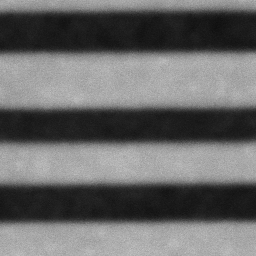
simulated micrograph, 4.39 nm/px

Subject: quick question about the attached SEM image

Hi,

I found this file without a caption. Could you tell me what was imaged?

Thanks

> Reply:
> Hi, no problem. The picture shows one or a few lines or trenches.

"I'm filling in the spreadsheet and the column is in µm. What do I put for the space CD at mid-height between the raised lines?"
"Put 0.191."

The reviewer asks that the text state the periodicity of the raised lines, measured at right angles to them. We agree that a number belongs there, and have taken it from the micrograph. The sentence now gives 376 nm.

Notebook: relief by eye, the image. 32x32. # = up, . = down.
................................
################################
################################
################################
################################
################################
################################
................................
................................
................................
................................
................................
................................
################################
################################
################################
################################
################################
................................
................................
................................
................................
................................
################################
################################
################################
################################
################################
................................
................................
................................
................................